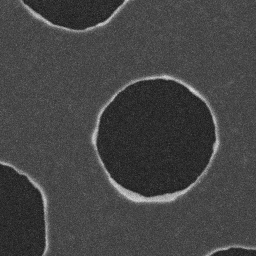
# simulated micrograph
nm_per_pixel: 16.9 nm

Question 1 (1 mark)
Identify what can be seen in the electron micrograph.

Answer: holes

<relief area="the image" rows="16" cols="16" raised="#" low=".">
##.....#########
###...##########
################
################
################
########....####
#######......###
######.......###
######........##
######.......###
.######......###
..#####.....####
...#############
...#############
...#############
...#############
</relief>